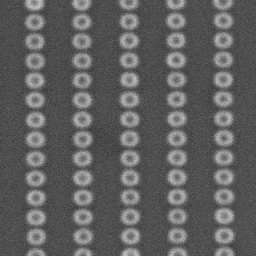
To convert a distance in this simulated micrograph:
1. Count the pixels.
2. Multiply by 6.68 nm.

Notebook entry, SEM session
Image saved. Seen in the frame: a regular array of raised bodies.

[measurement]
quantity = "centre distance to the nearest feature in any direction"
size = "130 nm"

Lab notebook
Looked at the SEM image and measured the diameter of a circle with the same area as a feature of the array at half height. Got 94.7 nm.